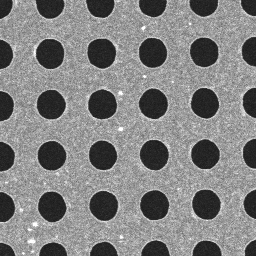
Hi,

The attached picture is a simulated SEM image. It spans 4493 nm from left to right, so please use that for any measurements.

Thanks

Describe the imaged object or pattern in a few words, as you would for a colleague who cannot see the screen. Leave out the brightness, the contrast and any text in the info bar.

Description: a regular array of holes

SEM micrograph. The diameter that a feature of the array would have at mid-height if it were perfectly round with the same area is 516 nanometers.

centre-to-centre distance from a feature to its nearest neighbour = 893 nanometres